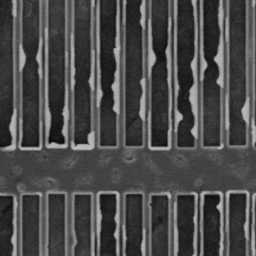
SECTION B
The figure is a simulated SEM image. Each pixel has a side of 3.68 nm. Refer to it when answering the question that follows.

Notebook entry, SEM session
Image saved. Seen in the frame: parallel lines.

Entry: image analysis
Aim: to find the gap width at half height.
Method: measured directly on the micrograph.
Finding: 62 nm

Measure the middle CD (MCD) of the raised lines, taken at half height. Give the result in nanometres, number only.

33.1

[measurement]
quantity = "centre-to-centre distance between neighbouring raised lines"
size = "95 nm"